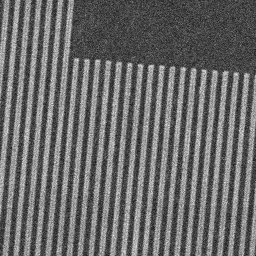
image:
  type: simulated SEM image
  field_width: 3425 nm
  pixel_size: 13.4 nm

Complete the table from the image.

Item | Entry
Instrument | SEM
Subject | parallel lines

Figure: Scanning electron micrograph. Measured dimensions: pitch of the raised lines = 143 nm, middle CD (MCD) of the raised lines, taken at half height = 0.0499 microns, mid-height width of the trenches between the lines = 98.2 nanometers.